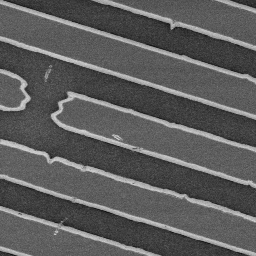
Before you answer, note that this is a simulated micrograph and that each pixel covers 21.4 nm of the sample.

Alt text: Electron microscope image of one or a few lines or trenches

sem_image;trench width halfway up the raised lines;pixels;30.3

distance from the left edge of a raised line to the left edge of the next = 66.3 px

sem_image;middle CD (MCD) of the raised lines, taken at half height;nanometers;762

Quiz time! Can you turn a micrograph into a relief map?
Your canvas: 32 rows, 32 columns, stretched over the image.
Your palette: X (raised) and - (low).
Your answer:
X-------------XXXXXXXXXXXXXXX---
XXXX-------------XXXXXXXXXXXXXXX
XXXXXXXX------------XXXXXXXXXXXX
XXXXXXXXXXX-------------XXXXXXXX
XXXXXXXXXXXXXX-------------XXXXX
--XXXXXXXXXXXXXXX-------------XX
-----XXXXXXXXXXXXXXXX-----------
--------XXXXXXXXXXXXXXXX--------
------------XXXXXXXXXXXXXXX-----
XX-------------XXXXXXXXXXXXXXXX-
XXX---------------XXXXXXXXXXXXXX
XXX-------------------XXXXXXXXXX
XXX-----XXXX-------------XXXXXXX
XXX-----XXXXXXX-------------XXXX
-------XXXXXXXXXXX-------------X
-------XXXXXXXXXXXXXX-----------
----------XXXXXXXXXXXXXXX-------
-------------XXXXXXXXXXXXXXX----
XXX-------------XXXXXXXXXXXXXXX-
XXXXXX--------------XXXXXXXXXXXX
XXXXXXXXX--------------XXXXXXXXX
XXXXXXXXXXXXX-------------XXXXXX
-XXXXXXXXXXXXXXX-------------XXX
----XXXXXXXXXXXXXXX-------------
-------XXXXXXXXXXXXXXXX---------
-----------XXXXXXXXXXXXXXX------
XX------------XXXXXXXXXXXXXXX---
XXXXX-------------XXXXXXXXXXXXXX
XXXXXXXX-------------XXXXXXXXXXX
XXXXXXXXXXXX------------XXXXXXXX
XXXXXXXXXXXXXXX------------XXXXX
-XXXXXXXXXXXXXXXXX-------------X